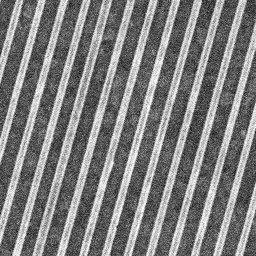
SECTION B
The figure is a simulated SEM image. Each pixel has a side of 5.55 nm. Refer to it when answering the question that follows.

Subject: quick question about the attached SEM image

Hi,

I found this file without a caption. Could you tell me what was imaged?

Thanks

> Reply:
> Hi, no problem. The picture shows parallel lines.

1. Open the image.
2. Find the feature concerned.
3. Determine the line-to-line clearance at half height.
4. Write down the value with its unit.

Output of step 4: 83.5 nm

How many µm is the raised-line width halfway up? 0.036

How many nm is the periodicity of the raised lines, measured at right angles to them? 119